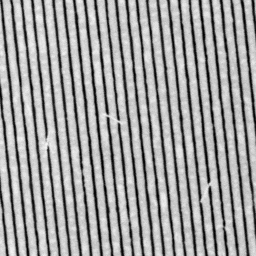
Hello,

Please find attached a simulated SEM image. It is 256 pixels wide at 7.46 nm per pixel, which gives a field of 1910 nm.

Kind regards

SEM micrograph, parallel lines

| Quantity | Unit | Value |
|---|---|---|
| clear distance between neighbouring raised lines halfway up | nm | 19.5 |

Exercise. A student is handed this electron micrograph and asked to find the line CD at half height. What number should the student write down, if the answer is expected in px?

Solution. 7.83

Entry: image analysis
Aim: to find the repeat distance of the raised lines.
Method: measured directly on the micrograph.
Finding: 77.8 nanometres